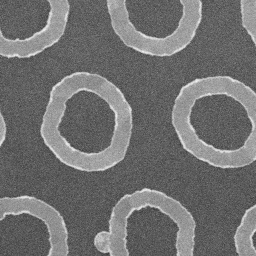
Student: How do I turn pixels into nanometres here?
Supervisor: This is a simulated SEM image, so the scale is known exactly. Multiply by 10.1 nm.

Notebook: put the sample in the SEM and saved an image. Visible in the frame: ring-shaped raised bodies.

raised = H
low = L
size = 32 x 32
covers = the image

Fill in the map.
LLLLLLHHHLLLLLHHLLLLLLLHHLLLLLHH
LLLLLLHHHLLLLLHHLLLLLLLHHLLLLLHH
LLLLLLHHLLLLLLHHLLLLLLLHHLLLLLHH
LLLLLHHHLLLLLLHHHLLLLLHHHLLLLLLH
LLLLHHHHLLLLLLLHHHLLLHHHLLLLLLLH
HHHHHHHLLLLLLLLLHHHHHHHLLLLLLLLL
HHHHHLLLLLLLLLLLLLHHHHLLLLLLLLLL
LLLLLLLLLLLLLLLLLLLLLLLLLLLLLLLL
LLLLLLLLLLLLLLLLLLLLLLLLLLLLLLLL
LLLLLLLLLHHHLLLLLLLLLLLLLLLLLLLL
LLLLLLLHHHHHHHLLLLLLLLLLHHHHHHLL
LLLLLLHHHHLLHHHLLLLLLLLHHHHHHHHH
LLLLLLHHLLLLLHHHLLLLLLHHHLLLLLHH
LLLLLLHHLLLLLLHHLLLLLLHHLLLLLLLH
LLLLLLHHLLLLLLHHLLLLLLHHLLLLLLLH
HLLLLHHLLLLLLLHHLLLLLLHHLLLLLLLL
HLLLLHHLLLLLLLHHLLLLLLHHLLLLLLLH
LLLLLHHHLLLLLLHHLLLLLLLHHLLLLLLH
LLLLLLHHHLLLLHHHLLLLLLLHHHHLLLHH
LLLLLLLHHHHHHHHLLLLLLLLLHHHHHHHH
LLLLLLLLHHHHHHLLLLLLLLLLLLHHHHHL
LLLLLLLLLLLLLLLLLLLLLLLLLLLLLLLL
LLLLLLLLLLLLLLLLLLLLLLLLLLLLLLLL
LLLLLLLLLLLLLLLLLLLLLLLLLLLLLLLL
LLLLLLLLLLLLLLLLHHHHHLLLLLLLLLLL
HHHHHHLLLLLLLLLHHHHHHHLLLLLLLLLL
HHHHHHHLLLLLLLHHHLLLHHHLLLLLLLLH
LLLLLHHHLLLLLLHHLLLLLLHHLLLLLLHH
LLLLLLHHLLLLLLHHLLLLLLHHLLLLLLHH
LLLLLLHHLLLLHHHHLLLLLLHHLLLLLHHH
LLLLLLHHLLLLHHHHLLLLLLHHLLLLLHHH
LLLLLLHHLLLLLHHHLLLLLLHHLLLLLLHH